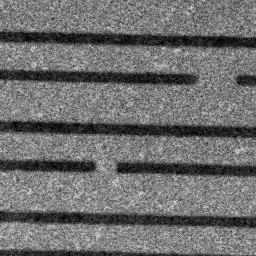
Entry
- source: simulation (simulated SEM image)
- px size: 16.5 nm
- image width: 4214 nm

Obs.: parallel lines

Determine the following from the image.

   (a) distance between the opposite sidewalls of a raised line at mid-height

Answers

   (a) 171 nanometres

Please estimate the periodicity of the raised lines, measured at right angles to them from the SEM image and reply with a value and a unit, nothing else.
737 nm